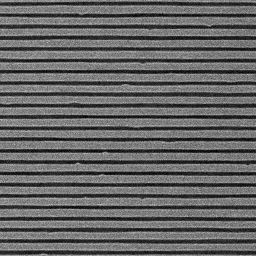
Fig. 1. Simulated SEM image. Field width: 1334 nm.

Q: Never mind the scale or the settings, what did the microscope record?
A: parallel lines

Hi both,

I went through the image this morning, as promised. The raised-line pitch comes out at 0.0589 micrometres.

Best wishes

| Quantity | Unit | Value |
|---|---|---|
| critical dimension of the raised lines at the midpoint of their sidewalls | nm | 40.4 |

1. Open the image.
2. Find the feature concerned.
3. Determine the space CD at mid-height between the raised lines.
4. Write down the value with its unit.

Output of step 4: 20.2 nanometres